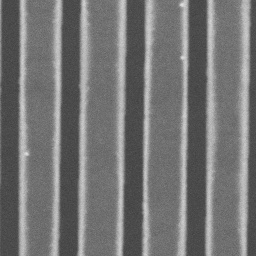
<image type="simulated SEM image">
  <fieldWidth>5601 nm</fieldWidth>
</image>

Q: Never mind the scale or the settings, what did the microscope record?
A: lines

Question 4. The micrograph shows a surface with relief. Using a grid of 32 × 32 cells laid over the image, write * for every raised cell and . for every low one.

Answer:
...*****..******..*****...*****.
...*****..******..*****...*****.
...*****..******..*****...*****.
...*****..******..*****...*****.
...*****..******..*****...*****.
...*****..******..*****...*****.
...*****..******..*****...*****.
...*****..******..*****...*****.
...*****..******..*****...*****.
...*****..******..*****...*****.
...*****..******..*****...*****.
...*****..******..*****...*****.
...*****..******..*****...*****.
...*****..*****...*****...*****.
...****...*****...*****...*****.
...****...*****...*****...*****.
...****...*****...*****...*****.
...****...*****...*****...*****.
...****...*****...*****...*****.
...****...*****...*****...*****.
...****...*****...*****...*****.
...****...*****...*****...*****.
...****...*****...*****...*****.
...****...*****...*****...*****.
...****...*****...*****...*****.
...****...*****...*****...*****.
...****...*****...*****...*****.
...****...*****...*****...*****.
...****...*****...*****...*****.
...****...*****...*****...*****.
...****...*****...*****...*****.
...****...*****...*****...*****.